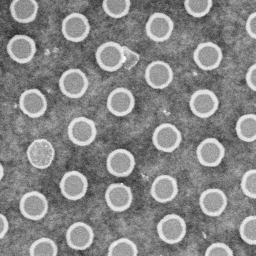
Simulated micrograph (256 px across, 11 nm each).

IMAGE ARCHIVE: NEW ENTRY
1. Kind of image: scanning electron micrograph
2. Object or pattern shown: a regular array of raised bodies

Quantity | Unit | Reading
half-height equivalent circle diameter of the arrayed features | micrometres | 0.275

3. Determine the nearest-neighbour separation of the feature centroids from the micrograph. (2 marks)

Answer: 505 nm